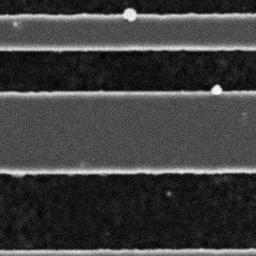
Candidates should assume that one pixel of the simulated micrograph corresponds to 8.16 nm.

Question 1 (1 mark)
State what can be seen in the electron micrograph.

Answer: lines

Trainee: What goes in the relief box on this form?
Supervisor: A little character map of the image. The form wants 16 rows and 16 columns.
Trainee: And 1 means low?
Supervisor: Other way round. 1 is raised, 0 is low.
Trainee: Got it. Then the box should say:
0000000000000000
1111111111111111
1111111111111111
0000000000000000
0000000000000000
0000000000000000
1111111111111111
1111111111111111
1111111111111111
1111111111111111
1111111111111111
0000000000000000
0000000000000000
0000000000000000
0000000000000000
0000000000000000